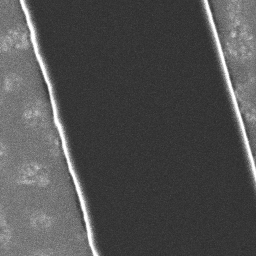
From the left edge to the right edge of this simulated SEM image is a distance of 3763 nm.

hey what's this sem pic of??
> one or a few lines or trenches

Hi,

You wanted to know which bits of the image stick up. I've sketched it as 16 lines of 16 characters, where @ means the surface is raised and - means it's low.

--@@@@@@@@@@@---
--@@@@@@@@@@@---
--@@@@@@@@@@@@--
--@@@@@@@@@@@@--
---@@@@@@@@@@@--
---@@@@@@@@@@@--
---@@@@@@@@@@@@-
----@@@@@@@@@@@-
----@@@@@@@@@@@-
----@@@@@@@@@@@@
----@@@@@@@@@@@@
-----@@@@@@@@@@@
-----@@@@@@@@@@@
-----@@@@@@@@@@@
------@@@@@@@@@@
------@@@@@@@@@@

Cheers